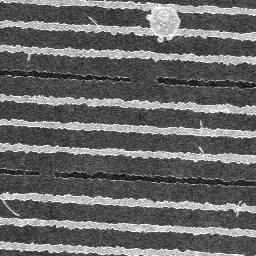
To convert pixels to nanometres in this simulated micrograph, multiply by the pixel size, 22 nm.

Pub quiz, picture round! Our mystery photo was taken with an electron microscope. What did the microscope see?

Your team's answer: parallel lines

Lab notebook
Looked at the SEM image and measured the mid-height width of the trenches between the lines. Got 412 nm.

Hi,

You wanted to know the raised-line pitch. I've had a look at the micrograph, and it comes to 539 nanometres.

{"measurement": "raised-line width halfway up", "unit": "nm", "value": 124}